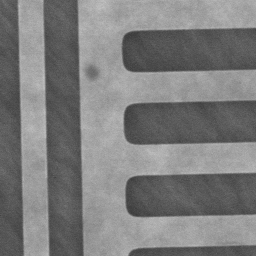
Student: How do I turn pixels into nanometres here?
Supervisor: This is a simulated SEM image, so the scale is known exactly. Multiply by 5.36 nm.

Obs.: groups of lines, slits or small figures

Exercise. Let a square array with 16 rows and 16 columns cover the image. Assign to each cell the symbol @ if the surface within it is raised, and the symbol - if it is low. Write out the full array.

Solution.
-@@--@@@@@@@@@@@
-@@--@@@@@@@@@@@
-@@--@@@--------
-@@--@@@--------
-@@--@@@@--@@@@@
-@@--@@@@@@@@@@@
-@@--@@@--------
-@@--@@@--------
-@@--@@@--------
-@@--@@@@@@@@@@@
-@@--@@@@@@@@@@@
-@@--@@@--------
-@@--@@@--------
-@@--@@@----@@@@
-@@--@@@@@@@@@@@
-@@--@@@@-------